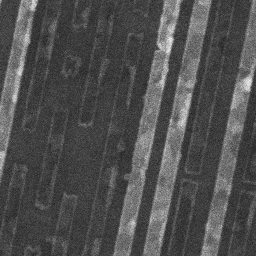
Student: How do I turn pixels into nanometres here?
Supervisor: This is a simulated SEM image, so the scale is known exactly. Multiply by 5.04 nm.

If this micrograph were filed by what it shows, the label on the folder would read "parallel lines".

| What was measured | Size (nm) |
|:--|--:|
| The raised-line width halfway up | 71.7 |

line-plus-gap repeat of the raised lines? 144 nanometres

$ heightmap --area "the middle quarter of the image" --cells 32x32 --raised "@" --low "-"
@@@@---@@@@----@@@----@@@@----@@
@@@@--@@@@-----@@@----@@@@---@@@
@@@---@@@@----@@@@----@@@@---@@@
------@@@@----@@@-----@@@----@@@
------@@@-----@@@----@@@@----@@@
------@@@-----@@@----@@@@----@@@
-----@@@@----@@@@----@@@@---@@@@
-----@@@-----@@@@----@@@----@@@@
-----@@@-----@@@@----@@@----@@@@
-----@@@-----@@@----@@@@----@@@-
-----@@@-----@@@----@@@@----@@@-
----@@@@-----@@@----@@@@---@@@@-
@---@@@-----@@@@----@@@----@@@@-
@---@@@-----@@@-----@@@----@@@@-
----@@@-----@@@----@@@@----@@@--
------------@@@----@@@@---@@@@--
-----------@@@@----@@@----@@@@--
-----------@@@@----@@@----@@@@--
-----------@@@-----@@@----@@@@--
-----------@@@@---@@@@----@@@---
----------@@@@@---@@@@---@@@@---
----------@@@@@---@@@----@@@@--@
----------@@@@----@@@----@@@@--@
----------@@@@----@@@----@@@@--@
----------@@@----@@@@----@@@@--@
---------@@@@----@@@@----@@@---@
---------@@@@----@@@----@@@@--@@
---------@@@@----@@@----@@@@----
---------@@@@----@@@----@@@@----
---------@@@@---@@@@----@@@---@@
--------@@@@@---@@@@---@@@@--@@@
--------@@@@----@@@@---@@@@--@@@